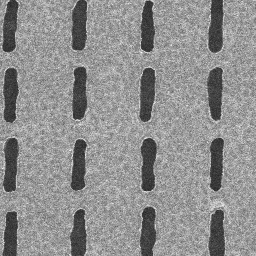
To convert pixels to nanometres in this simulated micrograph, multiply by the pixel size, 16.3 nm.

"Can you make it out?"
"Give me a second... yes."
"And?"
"a regular array of holes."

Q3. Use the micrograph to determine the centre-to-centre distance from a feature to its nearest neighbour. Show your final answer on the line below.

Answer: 1.11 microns